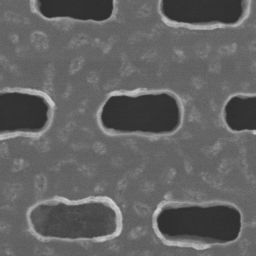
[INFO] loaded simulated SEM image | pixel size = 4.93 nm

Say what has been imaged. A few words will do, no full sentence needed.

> holes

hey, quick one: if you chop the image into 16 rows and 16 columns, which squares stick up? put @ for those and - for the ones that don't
@@-----@@@-----@
@@@@@@@@@@@@@@@@
@@@@@@@@@@@@@@@@
@@@@@@@@@@@@@@@@
@@@@@@@@@@@@@@@@
@@@@@@@@@@@@@@@@
---@@@@----@@@--
---@@@-----@@@--
@@@@@@@@@@@@@@@@
@@@@@@@@@@@@@@@@
@@@@@@@@@@@@@@@@
@@@@@@@@@@@@@@@@
@@@@@@@@@@@@@@@@
@@@---@@@@-----@
@@@---@@@@-----@
@@@@@@@@@@@@@@@@